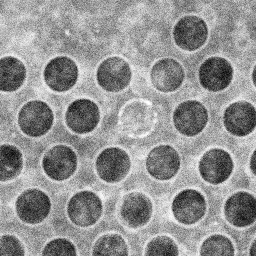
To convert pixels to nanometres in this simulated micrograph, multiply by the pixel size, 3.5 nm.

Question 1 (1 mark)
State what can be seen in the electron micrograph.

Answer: a regular array of holes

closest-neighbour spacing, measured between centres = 172 nanometres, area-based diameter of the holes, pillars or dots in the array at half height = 128 nanometres